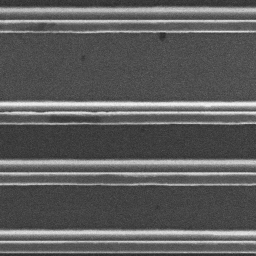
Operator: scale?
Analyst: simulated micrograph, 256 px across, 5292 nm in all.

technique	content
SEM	lines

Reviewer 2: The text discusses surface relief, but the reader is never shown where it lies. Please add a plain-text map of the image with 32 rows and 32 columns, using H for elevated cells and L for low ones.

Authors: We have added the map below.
LLLLLLLLLLLLLLLLLLLLLLLLLLLLLLLL
HHHHHHHHHHHHHHHHHHHHHHHHHHHHHHHH
HHHHHHHHHHHHHHHHHHHHHHHHHHHHHHHH
HHHHHHHHHHHHHHHHHHHHHHHHHHHHHHHH
LLLLLLLLLLLLLLLLLLLLLLLLLLLLLLLL
LLLLLLLLLLLLLLLLLLLLLLLLLLLLLLLL
LLLLLLLLLLLLLLLLLLLLLLLLLLLLLLLL
LLLLLLLLLLLLLLLLLLLLLLLLLLLLLLLL
LLLLLLLLLLLLLLLLLLLLLLLLLLLLLLLL
LLLLLLLLLLLLLLLLLLLLLLLLLLLLLLLL
LLLLLLLLLLLLLLLLLLLLLLLLLLLLLLLL
LLLLLLLLLLLLLLLLLLLLLLLLLLLLLLLL
LLLLLLLLLLLLLLLLLLLLLLLLLLLLLLLL
HHHHHHHHHHHHHHHHHHHHHHHHHHHHHHHH
HHHHHHHHHHHHHHHHHHHHHHHHHHHHHHHH
LLLLLLLLLLLLLLLLLLLLLLLLLLLLLLLL
LLLLLLLLLLLLLLLLLLLLLLLLLLLLLLLL
LLLLLLLLLLLLLLLLLLLLLLLLLLLLLLLL
LLLLLLLLLLLLLLLLLLLLLLLLLLLLLLLL
LLLLLLLLLLLLLLLLLLLLLLLLLLLLLLLL
HHHHHHHHHHHHHHHHHHHHHHHHHHHHHHHH
HHHHHHHHHHHHHHHHHHHHHHHHHHHHHHHH
HHHHHHHHHHHHHHHHHHHHHHHHHHHHHHHH
LLLLLLLLLLLLLLLLLLLLLLLLLLLLLLLL
LLLLLLLLLLLLLLLLLLLLLLLLLLLLLLLL
LLLLLLLLLLLLLLLLLLLLLLLLLLLLLLLL
LLLLLLLLLLLLLLLLLLLLLLLLLLLLLLLL
LLLLLLLLLLLLLLLLLLLLLLLLLLLLLLLL
LLLLLLLLLLLLLLLLLLLLLLLLLLLLLLLL
HHHHHHHHHHHHHHHHHHHHHHHHHHHHHHHH
HHHHHHHHHHHHHHHHHHHHHHHHHHHHHHHH
LLLLLLLLLLLLLLLLLLLLLLHHLLLLLLHH